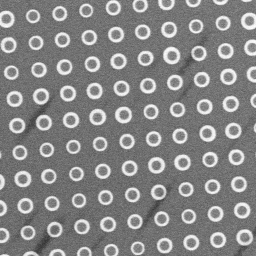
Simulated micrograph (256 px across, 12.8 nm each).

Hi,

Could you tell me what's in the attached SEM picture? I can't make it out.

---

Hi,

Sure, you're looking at an array of small figures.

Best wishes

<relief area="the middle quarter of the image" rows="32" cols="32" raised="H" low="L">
HHLLLHHHHLLLHHHLLLLLLLLLLLLLLLLL
HHLLLLHHLLLLLLLLLLLLLLLLLLLLLLLL
HLLLLLLLLLLLLLLLLLLLLLLLLLLLLLLL
LLLLLLLLLLLLLLLLLLLLLLLLLLHHHLLL
LLLLLLLLLLLLLHHLLLLHHHHLLLHHHHLL
LLLLLLHHHLLLLHHHLLLHHHHLLLHHHLLL
HHHLLLHHHLLLLHHHLLLHHHHLLLLLLLLL
HHHLLLHHHLLLLHHHLLLLLLLLLLLLLLLL
HHHLLLLHHLLLLLLLLLLLLLLLLLLLLLLL
LLLLLLLLLLLLLLLLLLLLLLLLLLLLLLLL
LLLLLLLLLLLLLLLLLLLLLHHLLLLHHHLL
LLLLLLLLHLLLLHHHLLLLHHHLLLLHHHLL
LHHLLLLHHHLLLHHHHLLLHHHLLLLHHHLL
HHHHLLHHHHLLLHHHHLLLLHHLLLLLLLLL
HHHHLLLHHHLLLLHHLLLLLLLLLLLLLLLL
HHHLLLLLLLLLLLLLLLLLLLLLLLLLLLLL
LLLLLLLLLLLLLLLLLLLLLLLLLLLLHHLL
LLLLLLLLLLLLLLLLLLLLLHHHLLLHHHHL
LLLLLLLLHHLLLLHHHLLLLHHHLLLHHHHL
LHHHLLLHHHHLLLHHHLLLLHHHLLLLHHLL
LHHHLLLHHHHLLLHHHLLLLLHLLLLLLLLL
LHHHLLLLHHLLLLLLLLLLLLLLLLLLLLLL
LLLLLLLLLLLLLLLLLLLLLLLLLLLLLLLL
LLLLLLLLLLLLLLLLLLLLLLHHLLLLHHHL
LLLLLLLLLLLLLLLHHHLLLHHHHLLLHHHL
LLLLLLLLHHHLLLLHHHLLLHHHHLLLHHHL
LLHHHLLLHHHHLLLHHHLLLHHHHLLLLHLL
LHHHHLLLHHHLLLLHHHLLLLLLLLLLLLLL
LLHHHLLLLHLLLLLLLLLLLLLLLLLLLLLL
LLLLLLLLLLLLLLLLLLLLLLLLLLLLLLLL
LLLLLLLLLLLLLLLLLLLLLLLHHLLLLHHH
LLLLLLLLLLLLLLLLHHLLLLHHHLLLLHHH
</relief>